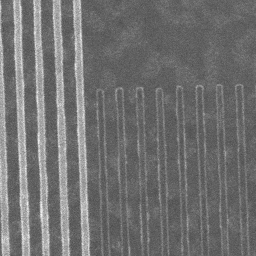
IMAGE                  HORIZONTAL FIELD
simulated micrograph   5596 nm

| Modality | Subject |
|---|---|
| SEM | parallel lines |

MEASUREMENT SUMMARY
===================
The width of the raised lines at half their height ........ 142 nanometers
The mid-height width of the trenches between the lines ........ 284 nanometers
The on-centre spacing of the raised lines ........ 436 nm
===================